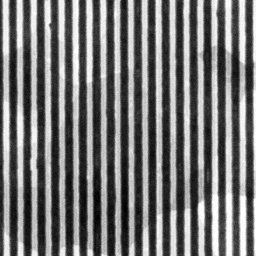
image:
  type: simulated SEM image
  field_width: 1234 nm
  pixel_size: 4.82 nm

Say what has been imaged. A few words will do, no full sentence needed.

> parallel lines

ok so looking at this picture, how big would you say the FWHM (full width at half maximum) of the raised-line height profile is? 26.5 nm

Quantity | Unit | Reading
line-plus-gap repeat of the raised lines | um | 0.0671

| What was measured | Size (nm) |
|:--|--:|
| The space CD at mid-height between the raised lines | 39.2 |